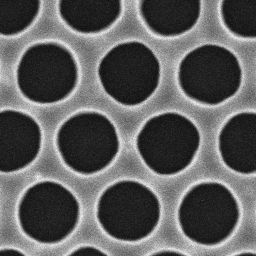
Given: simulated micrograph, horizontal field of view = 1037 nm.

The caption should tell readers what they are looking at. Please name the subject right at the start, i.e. a regular array of holes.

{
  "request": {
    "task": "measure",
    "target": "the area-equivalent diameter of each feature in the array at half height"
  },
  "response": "0.251 microns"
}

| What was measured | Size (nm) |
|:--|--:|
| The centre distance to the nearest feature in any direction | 324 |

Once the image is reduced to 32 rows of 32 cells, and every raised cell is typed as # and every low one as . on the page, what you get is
.....##........##........###....
.....##........##........###....
....####.......###.......###....
...######.....#####.....####....
####################..########..
####...########...########.#####
###......#####.....#####.....###
###......####.......###.......##
##........##........##........##
##........##........##........##
##........###.......##........##
###......####......####.......##
####....######....######....####
################################
....#####....#######...######...
.....###......####......####....
.....##........###.......##.....
.....##........##........##.....
.....##........##........##.....
.....###......####......####....
....####......####......####....
#.########..#######...########..
################################
####....#####......#####....####
###......####.......###......###
##........##........###.......##
##........##........##........##
##........##........##........##
###......####......####......###
####.....#####....#####......###
#########################..#####
..#######....#######..##########